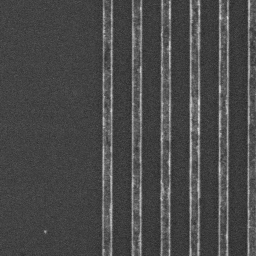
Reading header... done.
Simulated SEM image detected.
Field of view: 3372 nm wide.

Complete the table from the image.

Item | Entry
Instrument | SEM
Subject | parallel lines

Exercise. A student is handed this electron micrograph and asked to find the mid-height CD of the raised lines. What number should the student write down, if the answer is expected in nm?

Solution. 110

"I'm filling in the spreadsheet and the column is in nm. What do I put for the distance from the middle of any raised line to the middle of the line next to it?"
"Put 383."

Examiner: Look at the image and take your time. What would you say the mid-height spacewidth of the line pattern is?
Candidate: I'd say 275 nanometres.